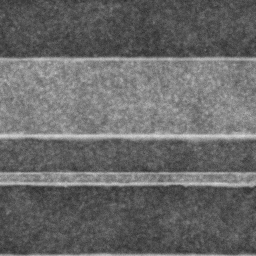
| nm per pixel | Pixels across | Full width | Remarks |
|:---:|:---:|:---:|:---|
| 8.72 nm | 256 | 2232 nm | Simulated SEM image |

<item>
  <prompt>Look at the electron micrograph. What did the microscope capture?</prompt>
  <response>lines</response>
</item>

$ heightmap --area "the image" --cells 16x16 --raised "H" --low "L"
LLLLLLLLLLLLLLLL
LLLLLLLLLLLLLLLL
LLLLLLLLLLLLLLLL
LLLLLLLLLLLLLLLL
HHHHHHHHHHHHHHHH
HHHHHHHHHHHHHHHH
HHHHHHHHHHHHHHHH
HHHHHHHHHHHHHHHH
HHHHHHHHHHHHHHHH
HHHHHHHHHHHHHHHH
HHHHHHHHHHHHHHHH
LHLLHLLLLLHHLLLH
LLLLLLLLLLLLLLLL
LLLLLLLLLLLLLLLL
LLLLLLLLLLLLLLLL
LLLLLLLLLLLLLLLL